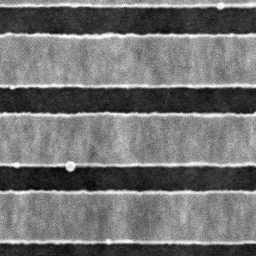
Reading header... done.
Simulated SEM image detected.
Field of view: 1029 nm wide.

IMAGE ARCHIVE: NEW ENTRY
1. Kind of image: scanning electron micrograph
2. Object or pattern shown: lines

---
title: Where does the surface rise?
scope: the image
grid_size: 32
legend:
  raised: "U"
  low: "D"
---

UUUUUUUUUUUUUUUUUUUUUUUUUUUUUUUU
DDDDDDDDDDDDDDDDDDDDDDDDDDDDDDDD
DDDDDDDDDDDDDDDDDDDDDDDDDDDDDDDD
DDDDDDDDDDDDDDDDDDDDDDDDDDDDDDDD
UUUUUUUUUUUUUUUUUUUUUUUUUUUUUUUU
UUUUUUUUUUUUUUUUUUUUUUUUUUUUUUUU
UUUUUUUUUUUUUUUUUUUUUUUUUUUUUUUU
UUUUUUUUUUUUUUUUUUUUUUUUUUUUUUUU
UUUUUUUUUUUUUUUUUUUUUUUUUUUUUUUU
UUUUUUUUUUUUUUUUUUUUUUUUUUUUUUUU
UUUUUUUUUUUUUUUUUUUUUUUUUUUUUUUU
DDDDDDDDDDDDDDDDDDDDDDDDDDDDDDDD
DDDDDDDDDDDDDDDDDDDDDDDDDDDDDDDD
DDDDDDDDDDDDDDDDDDDDDDDDDDDDDDDD
UUUUUUUUUUUUUUUUUUUUUUUUUUUUUUUU
UUUUUUUUUUUUUUUUUUUUUUUUUUUUUUUU
UUUUUUUUUUUUUUUUUUUUUUUUUUUUUUUU
UUUUUUUUUUUUUUUUUUUUUUUUUUUUUUUU
UUUUUUUUUUUUUUUUUUUUUUUUUUUUUUUU
UUUUUUUUUUUUUUUUUUUUUUUUUUUUUUUU
UUUUUUUUUUUUUUUUUUUUUUUUUUUUUUUU
DDDDDDDDDDDDDDDDDDDDDDDDDDDDDDDD
DDDDDDDDDDDDDDDDDDDDDDDDDDDDDDDD
DDDDDDDDDDDDDDDDDDDDDDDDDDDDDDDD
UUUUUUUUUUUUUUUUUUUUUUUUUUUUUUUU
UUUUUUUUUUUUUUUUUUUUUUUUUUUUUUUU
UUUUUUUUUUUUUUUUUUUUUUUUUUUUUUUU
UUUUUUUUUUUUUUUUUUUUUUUUUUUUUUUU
UUUUUUUUUUUUUUUUUUUUUUUUUUUUUUUU
UUUUUUUUUUUUUUUUUUUUUUUUUUUUUUUU
DDDDDDDDDDDDDDDDDDDDDDDDDDDDDDDD
DDDDDDDDDDDDDDDDDDDDDDDDDDDDDDDD